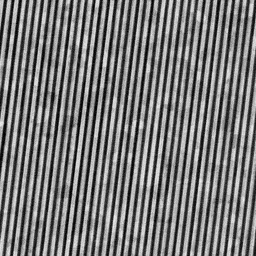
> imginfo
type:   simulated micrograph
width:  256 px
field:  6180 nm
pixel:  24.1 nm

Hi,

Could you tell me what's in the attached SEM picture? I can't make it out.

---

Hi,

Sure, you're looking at parallel lines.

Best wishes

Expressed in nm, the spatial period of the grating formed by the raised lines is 176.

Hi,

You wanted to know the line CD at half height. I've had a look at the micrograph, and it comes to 92.9 nm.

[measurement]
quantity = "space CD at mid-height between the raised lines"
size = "0.0959 micrometres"